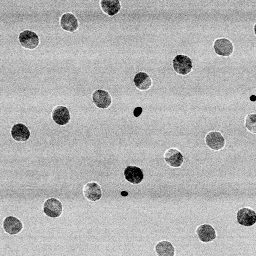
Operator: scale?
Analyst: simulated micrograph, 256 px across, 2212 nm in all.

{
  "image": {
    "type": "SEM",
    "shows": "a regular array of raised bodies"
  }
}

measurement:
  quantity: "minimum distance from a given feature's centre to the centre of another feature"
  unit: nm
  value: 379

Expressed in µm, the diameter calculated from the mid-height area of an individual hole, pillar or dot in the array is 0.17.